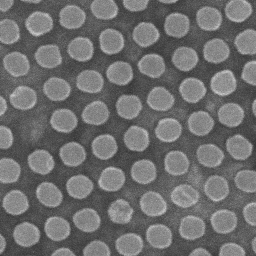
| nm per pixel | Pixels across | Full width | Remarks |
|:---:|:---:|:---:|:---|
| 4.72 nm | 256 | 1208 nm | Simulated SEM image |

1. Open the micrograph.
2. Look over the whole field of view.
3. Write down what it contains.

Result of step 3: a regular array of raised bodies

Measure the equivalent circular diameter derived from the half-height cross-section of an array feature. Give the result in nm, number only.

114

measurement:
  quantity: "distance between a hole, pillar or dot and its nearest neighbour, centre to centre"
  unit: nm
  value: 152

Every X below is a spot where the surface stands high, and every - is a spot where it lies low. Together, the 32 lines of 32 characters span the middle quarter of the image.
------------XXXXX--XXXXXX---XXXX
-----------XXXXXX--XXXXXX----XX-
----XXXXX--XXXXXX---XXXX--------
---XXXXXXX-XXXXXX---------------
X--XXXXXXX--XXXX--------------XX
X---XXXXXX-------------------XXX
X---XXXXX-------------XXXX---XXX
X--------------------XXXXXX--XXX
--------------XXXX---XXXXXX---XX
--------X----XXXXXX--XXXXXX-----
------XXXX---XXXXXX---XXXXX-----
X----XXXXXX--XXXXXX----XXX------
XX---XXXXXX---XXXXX-------------
XXX--XXXXXX----XX--------------X
XXX---XXXX--------------XXXX---X
XXX---------------------XXXXX--X
XX--------------XXXX---XXXXXX---
---------------XXXXXX--XXXXXX---
--------XXXX---XXXXXX---XXXX----
-------XXXXXX--XXXXXX-----------
XXXX---XXXXXX---XXXXX-----------
XXXXX--XXXXXX-----XX------------
XXXXX---XXXX--------------XXXX--
XXXXX----XX--------------XXXXXX-
XXXX--------------XXXX---XXXXXX-
-----------------XXXXXX--XXXXXX-
----------XXXX---XXXXXX---XXXXX-
---------XXXXXX--XXXXXX----XX---
--XXXX---XXXXXX--XXXXXX---------
-XXXXXX--XXXXXX---XXX-----------
-XXXXXX--XXXXX---------------XX-
-XXXXXX----XX---------------XXXX